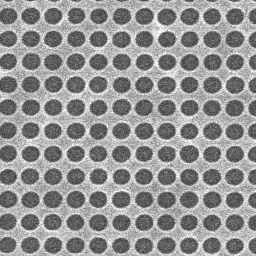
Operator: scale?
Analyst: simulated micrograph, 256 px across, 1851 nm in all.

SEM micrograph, a regular array of holes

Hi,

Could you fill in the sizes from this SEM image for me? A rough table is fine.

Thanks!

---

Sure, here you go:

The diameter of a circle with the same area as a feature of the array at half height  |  128 nanometres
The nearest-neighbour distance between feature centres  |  162 nanometres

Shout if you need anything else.